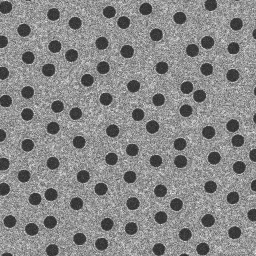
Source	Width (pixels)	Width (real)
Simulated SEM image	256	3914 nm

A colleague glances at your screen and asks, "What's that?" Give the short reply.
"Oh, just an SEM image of a regular array of holes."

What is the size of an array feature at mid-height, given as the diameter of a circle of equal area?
197 nm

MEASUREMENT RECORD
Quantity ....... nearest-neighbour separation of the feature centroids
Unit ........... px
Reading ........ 22.9